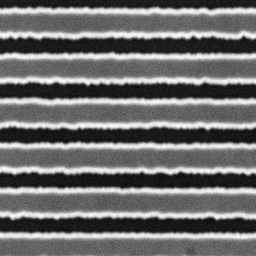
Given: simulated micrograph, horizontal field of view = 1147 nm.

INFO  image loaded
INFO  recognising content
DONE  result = lines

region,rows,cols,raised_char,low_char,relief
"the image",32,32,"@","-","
--------------------------------
@@@@@@@@@@@@@@@@@@@@@@@@@@@@@@@@
@@@@@@@@@@@@@@@@@@@@@@@@@@@@@@@@
@@@@@@@@@@@@@@@@@@@@@@@@@@@@@@@@
@@@@@@@@@@@@@@@@@@@@@@@@@@-@@@-@
--------------------------------
--------------------------------
@@@@@@@@@@@@@@@@@@@@@@@@@@@@@@@@
@@@@@@@@@@@@@@@@@@@@@@@@@@@@@@@@
@@@@@@@@@@@@@@@@@@@@@@@@@@@@@@@@
--------------------------------
--------------------------------
@@@@@--@-@@@@@@@@@-@@@-@@@@-@@-@
@@@@@@@@@@@@@@@@@@@@@@@@@@@@@@@@
@@@@@@@@@@@@@@@@@@@@@@@@@@@@@@@@
@@@@@@@@@@@@@@@@@@@@@@@@@@@@@@@@
--------------------------------
--------------------------------
@@@@@@@@@@@@@@@@@@@@@@@@@@@@@@@@
@@@@@@@@@@@@@@@@@@@@@@@@@@@@@@@@
@@@@@@@@@@@@@@@@@@@@@@@@@@@@@@@@
-@----@-@@--@@@---@@@@--@@@--@@@
--------------------------------
--------------------------------
@@@@@@@@@@@@@@@@@@@@@@@@@@@@@@@@
@@@@@@@@@@@@@@@@@@@@@@@@@@@@@@@@
@@@@@@@@@@@@@@@@@@@@@@@@@@@@@@@@
--------------------------------
--------------------------------
@@@@@@@@@@@@@@@@@@@@@@@@@@@@@@@@
@@@@@@@@@@@@@@@@@@@@@@@@@@@@@@@@
@@@@@@@@@@@@@@@@@@@@@@@@@@@@@@@@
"